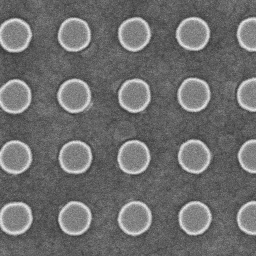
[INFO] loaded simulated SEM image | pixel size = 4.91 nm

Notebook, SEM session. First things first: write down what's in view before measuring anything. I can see a regular array of raised bodies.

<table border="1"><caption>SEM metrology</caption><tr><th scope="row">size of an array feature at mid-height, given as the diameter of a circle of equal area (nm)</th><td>159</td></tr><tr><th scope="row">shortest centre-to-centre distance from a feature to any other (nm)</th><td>292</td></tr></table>